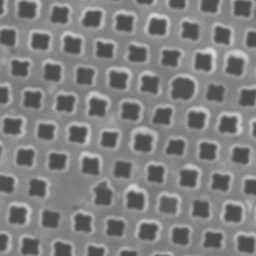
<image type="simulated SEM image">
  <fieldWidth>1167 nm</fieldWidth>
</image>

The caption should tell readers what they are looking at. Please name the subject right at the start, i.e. a regular array of holes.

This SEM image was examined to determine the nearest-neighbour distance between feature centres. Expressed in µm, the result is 0.148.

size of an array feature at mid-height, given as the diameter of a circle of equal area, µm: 0.0821